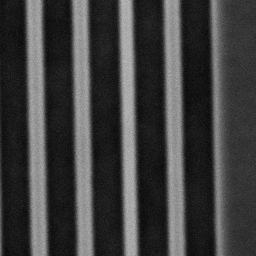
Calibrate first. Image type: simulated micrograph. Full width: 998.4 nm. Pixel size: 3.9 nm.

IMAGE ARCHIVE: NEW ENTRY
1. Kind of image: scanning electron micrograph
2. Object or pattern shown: parallel lines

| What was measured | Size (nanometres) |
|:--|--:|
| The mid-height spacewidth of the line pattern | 126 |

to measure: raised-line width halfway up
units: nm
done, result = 57.7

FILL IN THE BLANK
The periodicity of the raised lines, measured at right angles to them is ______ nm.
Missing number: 179